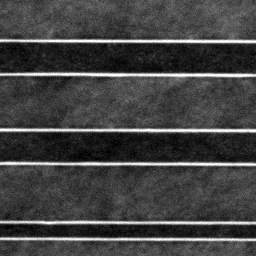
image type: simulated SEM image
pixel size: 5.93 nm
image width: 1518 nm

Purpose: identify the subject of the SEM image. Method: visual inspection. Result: one or a few lines or trenches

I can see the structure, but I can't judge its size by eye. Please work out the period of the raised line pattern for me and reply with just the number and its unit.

514 nanometres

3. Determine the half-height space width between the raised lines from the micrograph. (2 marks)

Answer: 335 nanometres